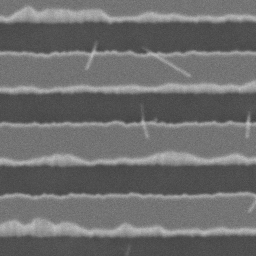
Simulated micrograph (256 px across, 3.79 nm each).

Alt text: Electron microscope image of lines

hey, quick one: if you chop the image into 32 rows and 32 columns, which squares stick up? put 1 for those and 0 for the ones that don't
11111111111111111111111111111111
11111111111111111111111111111111
11001000000001111111111111111111
00000000000000000000000000000000
00000000000000000000000000000000
00000000000000000000000000000000
11000000010101101000000111010111
11111111111111111111111111111111
11111111111111111111111111111111
11111111111111111111111111111111
11111111111111111111111111111111
01101110000000000000000000000000
00000000000000000000000000000000
00000000000000000000000000000000
00000000000000000000000000000000
11011110111111111111101111111111
11111111111111111111111111111111
11111111111111111111111111111111
11111111111111111111111111111111
11111111111111111111111111111111
11110000001100000000000000000000
00000000000000000000000000000000
00000000000000000000000000000000
00000000000000000000000000000000
11110110111111111111111111111111
11111111111111111111111111111111
11111111111111111111111111111111
11111111111111111111111111111111
11111111111111111111111111111111
00000000000000000000000000000000
00000000000000000000000000000000
00000000000000000000000000000000